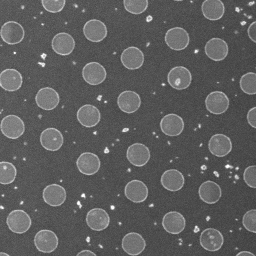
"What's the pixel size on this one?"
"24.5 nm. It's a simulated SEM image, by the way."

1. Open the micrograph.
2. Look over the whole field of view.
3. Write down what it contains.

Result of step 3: a regular array of raised bodies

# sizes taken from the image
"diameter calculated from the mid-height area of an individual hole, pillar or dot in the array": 0.549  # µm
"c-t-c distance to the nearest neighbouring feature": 1010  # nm